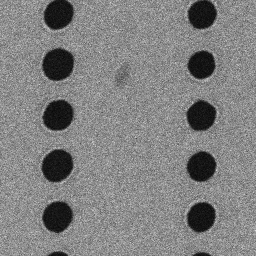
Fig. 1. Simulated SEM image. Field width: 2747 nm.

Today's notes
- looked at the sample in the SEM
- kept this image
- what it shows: a regular array of holes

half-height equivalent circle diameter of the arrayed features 0.321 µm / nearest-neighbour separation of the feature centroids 542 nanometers